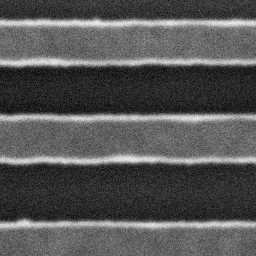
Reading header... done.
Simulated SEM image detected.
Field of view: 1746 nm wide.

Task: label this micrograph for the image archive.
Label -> lines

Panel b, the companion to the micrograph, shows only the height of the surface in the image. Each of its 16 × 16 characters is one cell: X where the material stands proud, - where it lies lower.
----------------
XXXXXXXXXXXXXXXX
XXXXXXXXXXXXXXXX
XXXXXXXXXXXXXXXX
----------------
----------------
----------------
XXXXXXXXXXXXXXXX
XXXXXXXXXXXXXXXX
XXXXXXXXXXXXXXXX
----------------
----------------
----------------
----------------
XXXXXXXXXXXXXXXX
XXXXXXXXXXXXXXXX